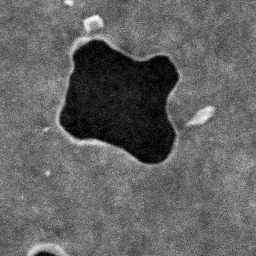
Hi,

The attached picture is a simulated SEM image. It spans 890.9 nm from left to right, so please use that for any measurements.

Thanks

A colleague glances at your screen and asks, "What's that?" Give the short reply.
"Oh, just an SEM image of holes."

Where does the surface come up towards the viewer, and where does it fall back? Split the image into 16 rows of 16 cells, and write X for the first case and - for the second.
XXXXXXXXXXXXXXXX
XXXXXXXXXXXXXXXX
XXXXXXXXXXXXXXXX
XXXXX---XXXXXXXX
XXXXX------XXXXX
XXXX-------XXXXX
XXXX------XXXXXX
XXXX-------XXXXX
XXXX-------XXXXX
XXXXXXXX---XXXXX
XXXXXXXXXXXXXXXX
XXXXXXXXXXXXXXXX
XXXXXXXXXXXXXXXX
XXXXXXXXXXXXXXXX
XXXXXXXXXXXXXXXX
XXXXXXXXXXXXXXXX